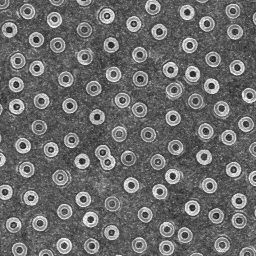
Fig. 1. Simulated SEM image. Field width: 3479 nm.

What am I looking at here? a regular array of ring-shaped raised bodies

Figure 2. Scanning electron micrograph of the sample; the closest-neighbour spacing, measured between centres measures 312 nm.